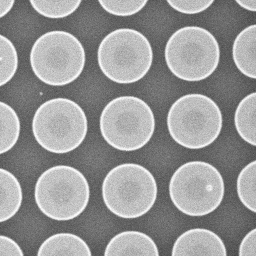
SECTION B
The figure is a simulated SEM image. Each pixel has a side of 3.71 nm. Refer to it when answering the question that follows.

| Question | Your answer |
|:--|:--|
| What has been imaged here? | an array of small figures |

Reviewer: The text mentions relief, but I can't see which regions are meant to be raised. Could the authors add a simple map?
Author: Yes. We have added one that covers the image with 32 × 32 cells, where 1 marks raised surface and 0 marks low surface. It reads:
11001111110001111100011111000011
10000111100000111000000110000000
00000000000000000000000000000000
00000000000000000000000110000001
00000111100001111100001111100011
10001111110001111110011111100111
11001111110011111110011111100111
11001111111011111110011111100111
11001111110001111110011111100011
11000111110001111100001111000001
00000011000000000000000000000000
00000000000000000000000000000000
00000001100000111100001111000011
10000111110001111110011111100011
11001111111001111110011111110111
11001111111001111110011111110111
11001111111001111110011111100011
11000111110001111110001111100001
10000011100000011000000010000000
00000000000000000000000000000000
00000000000000000000000111000001
10000011110000111110001111100011
11000111111001111110011111110011
11101111111001111111011111110011
11101111111001111110011111110011
11100111111001111110001111100011
11000111110000111100000111000000
10000000000000000000000000000000
00000000000000000000000000000000
00000001100000111100000111100001
11000111111000111110001111110011
11100111111001111111001111110011